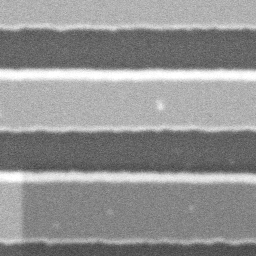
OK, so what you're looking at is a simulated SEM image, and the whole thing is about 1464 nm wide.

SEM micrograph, lines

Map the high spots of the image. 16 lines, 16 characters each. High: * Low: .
****************
****************
................
................
................
****************
****************
****************
................
................
................
****************
****************
****************
****************
................